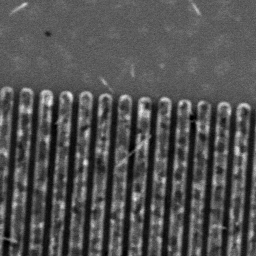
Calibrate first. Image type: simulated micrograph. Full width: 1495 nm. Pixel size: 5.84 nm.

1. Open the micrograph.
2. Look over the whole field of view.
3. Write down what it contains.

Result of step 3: parallel lines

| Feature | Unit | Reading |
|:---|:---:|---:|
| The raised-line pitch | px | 19.7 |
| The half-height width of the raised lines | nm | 69.8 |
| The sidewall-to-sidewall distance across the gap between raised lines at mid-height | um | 0.0451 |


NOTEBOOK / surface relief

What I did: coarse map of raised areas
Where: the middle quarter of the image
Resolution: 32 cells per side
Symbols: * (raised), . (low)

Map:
................................
................................
................................
................................
................................
................................
................................
*....*..........................
**..***..***..**................
**..***..***..***..***..**...**.
**..***..***..***..***..***..**.
**..***..***..***..***..***..***
**..***..**...***..***..**...***
**..**...**...**...**...**..***.
*...**...**...**...**...**..****
*...**...**...**...**..***..***.
*..***...**...**..***..***..***.
*..***...**..***..***..***..***.
*..***..***..***..***..***..***.
*..***..***..***..***..***..***.
*..***..***..***..***..***..***.
*..***..***..***.****..***..***.
*..***..***..***..***..***..***.
*..***..***..***..***..***..***.
*..***..***..***..***..***..***.
*..***..***..**...***..***..**..
*..***..**...**...***..**...**..
*..***..**...**...**...**...**..
*..**...**...**...**...**..***..
...**...**...**...**..***..***..
...**...**...**..***..***..***..
..***...**..***..***..***..***..